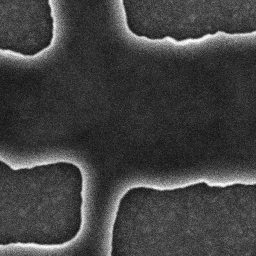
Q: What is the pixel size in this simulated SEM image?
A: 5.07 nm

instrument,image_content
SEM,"holes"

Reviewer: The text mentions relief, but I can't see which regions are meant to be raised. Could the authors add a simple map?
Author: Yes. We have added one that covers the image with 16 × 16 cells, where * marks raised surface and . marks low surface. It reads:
...*****........
...*****........
...********.****
****************
****************
****************
****************
****************
****************
****************
.*...***********
.....*******.*..
.....***........
.....**.........
.....**.........
*******.........